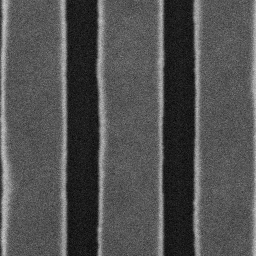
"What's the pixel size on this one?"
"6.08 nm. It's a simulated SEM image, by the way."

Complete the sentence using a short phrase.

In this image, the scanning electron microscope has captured lines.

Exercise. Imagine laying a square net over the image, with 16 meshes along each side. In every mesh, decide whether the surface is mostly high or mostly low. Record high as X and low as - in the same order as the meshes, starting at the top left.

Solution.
XXXX--XXXX--XXXX
XXXX--XXXX--XXXX
XXXX--XXXX--XXXX
XXXX--XXXX--XXXX
XXXX--XXXX--XXXX
XXXX--XXXX--XXXX
XXXX--XXXX--XXXX
XXXX--XXXX--XXXX
XXXX--XXXX--XXXX
XXXX--XXXX--XXXX
XXXX--XXXX--XXXX
XXXX--XXXX--XXXX
XXXX--XXXX--XXXX
XXXX--XXXX--XXXX
XXXX--XXXX--XXXX
XXXX--XXXX--XXXX